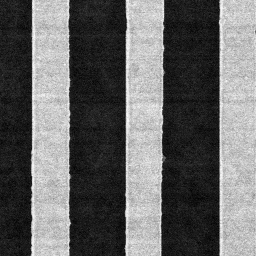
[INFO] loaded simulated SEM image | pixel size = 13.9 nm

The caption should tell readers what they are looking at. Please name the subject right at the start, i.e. lines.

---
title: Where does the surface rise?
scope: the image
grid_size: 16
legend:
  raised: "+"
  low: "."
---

..++....++....++
..++....++....++
..++....++....++
..++....++....++
..++....++....++
..++....++....++
..++....++....++
..++....++....++
..++....++....++
..++....++....++
..++....++....++
..++....++....++
..++....++....++
..++....++....++
..++....++....++
..++....++....++